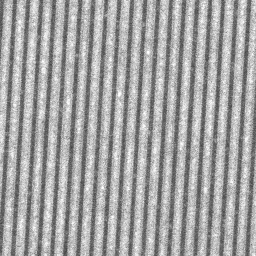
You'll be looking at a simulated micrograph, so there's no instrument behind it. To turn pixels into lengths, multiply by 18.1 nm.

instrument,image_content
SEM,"parallel lines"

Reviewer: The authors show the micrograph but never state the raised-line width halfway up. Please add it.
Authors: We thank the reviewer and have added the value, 101 nm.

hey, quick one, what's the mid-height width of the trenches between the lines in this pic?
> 126 nm